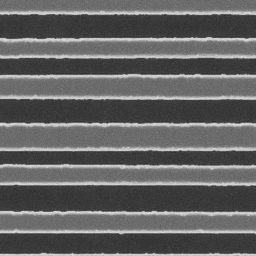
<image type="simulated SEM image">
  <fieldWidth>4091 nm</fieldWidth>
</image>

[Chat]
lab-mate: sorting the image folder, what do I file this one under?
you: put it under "lines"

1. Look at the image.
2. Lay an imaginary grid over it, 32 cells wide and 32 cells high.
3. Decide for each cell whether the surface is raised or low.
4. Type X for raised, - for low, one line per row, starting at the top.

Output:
XXXXXXXXXXXXXXXXXXXXXXXXXXXXXXXX
XXXXXXXXXXXXXXXXXXXXXXXXXXXXXXXX
--------------------------------
--------------------------------
--------------------------------
XXXXXXXXXXXXXXXXXXXXXXXXXXXXXXXX
XXXXXXXXXXXXXXXXXXXXXXXXXXXXXXXX
--------------------------------
--------------------------------
---------------XXX----XXX--XX---
XXXXXXXXXXXXXXXXXXXXXXXXXXXXXXXX
XXXXXXXXXXXXXXXXXXXXXXXXXXXXXXXX
--------------------------------
--------------------------------
--------------------------------
--------------------------------
XXXXXXXXXXXXXXXXXXXXXXXXXXXXXXXX
XXXXXXXXXXXXXXXXXXXXXXXXXXXXXXXX
XXXXXXXXXXXXXXXXXXXXXXXXXXXXXXXX
--------------------------------
--------------------------------
XXXXXXXXXXXXXXXXXXXXXXXXXXXXXXXX
XXXXXXXXXXXXXXXXXXXXXXXXXXXXXXXX
--------------------------------
--------------------------------
--------------------------------
--------------------------------
XXXXXXXXXXXXXXXXXXXXXXXXXXXXXXXX
XXXXXXXXXXXXXXXXXXXXXXXXXXXXXXXX
--------------------------------
--------------------------------
--------------------------------